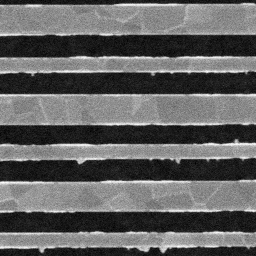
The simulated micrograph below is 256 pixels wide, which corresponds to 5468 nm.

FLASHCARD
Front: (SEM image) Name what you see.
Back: lines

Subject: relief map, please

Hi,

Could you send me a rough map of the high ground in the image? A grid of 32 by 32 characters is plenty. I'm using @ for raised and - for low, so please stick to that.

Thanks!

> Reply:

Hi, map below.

--------------------------------
@@@@@@@@@@@@@@@@@@@@@@@@@@@@@@@@
@@@@@@@@@@@@@@@@@@@@@@@@@@@@@@@@
@@@@@@@@@@@@@@@@@@@@@@@@@@@@@@@@
--------------------------------
--------------------------------
--------------------------------
@@@@@@@@@@@@@@@@@@@@@@@@@@@@@@@@
@@@@@@@@@@@@@@@@@@@@@@@@@@@@@@@@
--------------------------------
--------------------------------
--------------------------------
@@@@@@@@@@@@@@@@@@@@@@@@@@@@@@@@
@@@@@@@@@@@@@@@@@@@@@@@@@@@@@@@@
@@@@@@@@@@@@@@@@@@@@@@@@@@@@@@@@
@@@@@@@@@@@@@@@@@@@@@@@@@@@@----
--------------------------------
--------------------------------
@@@@@@@@@@@@@@@@@@@@@@@@@@@@@@@@
@@@@@@@@@@@@@@@@@@@@@@@@@@@@@@@@
--------------------------------
--------------------------------
--------------------------------
@@@@@@@@@@@@@@@@@@@@@@@@@@@@@@@@
@@@@@@@@@@@@@@@@@@@@@@@@@@@@@@@@
@@@@@@@@@@@@@@@@@@@@@@@@@@@@@@@@
--------------------------------
--------------------------------
--------------------------------
@@@@@@@@@@@@@@@@@@@@@@@@@@@@@@@@
@@@@@@@@@@@@@@@@@@@@@@@@@@@@@@@@
--------------------------------